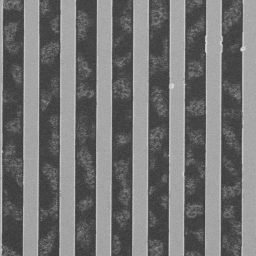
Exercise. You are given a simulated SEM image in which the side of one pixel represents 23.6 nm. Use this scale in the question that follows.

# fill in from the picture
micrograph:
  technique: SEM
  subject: parallel lines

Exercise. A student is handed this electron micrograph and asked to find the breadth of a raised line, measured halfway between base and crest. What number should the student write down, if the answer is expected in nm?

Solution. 348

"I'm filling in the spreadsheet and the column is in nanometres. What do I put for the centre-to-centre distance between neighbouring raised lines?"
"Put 858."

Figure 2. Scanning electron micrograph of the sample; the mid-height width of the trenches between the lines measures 512 nanometers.